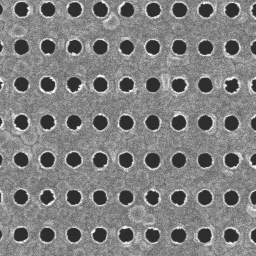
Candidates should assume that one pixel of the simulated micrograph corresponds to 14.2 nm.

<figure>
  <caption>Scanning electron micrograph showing a regular array of holes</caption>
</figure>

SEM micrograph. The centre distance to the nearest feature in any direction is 370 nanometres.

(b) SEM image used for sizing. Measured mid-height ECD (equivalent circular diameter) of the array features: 209 nanometers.